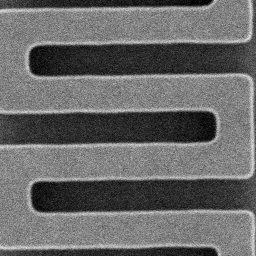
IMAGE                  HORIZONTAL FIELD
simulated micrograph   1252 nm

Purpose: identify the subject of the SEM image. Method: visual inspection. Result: groups of lines, slits or small figures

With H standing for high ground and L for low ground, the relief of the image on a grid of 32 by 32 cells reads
LLLLLLLLLLLLLLLLLLLLLLLLLLHHHHHL
HHHHHHHHHHHHHHHHHHHHHHHHHHHHHHHL
HHHHHHHHHHHHHHHHHHHHHHHHHHHHHHHL
HHHHHHHHHHHHHHHHHHHHHHHHHHHHHHHL
HHHHHHHHHHHHHHHHHHHHHHHHHHHHHHHL
HHHHHHHHHLLLLLLLLLLLLLLLLLLLLLLL
HHHHLLLLLLLLLLLLLLLLLLLLLLLLLLLL
HHHHLLLLLLLLLLLLLLLLLLLLLLLLLLLL
HHHHLLLLLLLLLLLLLLLLLLLLLLLLLLLL
HHHHHLLLLLHHLLLLHHHHHHHHHHHHHHHL
HHHHHHHHHHHHHHHHHHHHHHHHHHHHHHHH
HHHHHHHHHHHHHHHHHHHHHHHHHHHHHHHH
HHHHHHHHHHHHHHHHHHHHHHHHHHHHHHHH
HHHHHHHHHHHHHHHHHHHHHHHHHHHHHHHH
LLLLLLLLLLLLLLLLLLLLLLLLLLLHHHHH
LLLLLLLLLLLLLLLLLLLLLLLLLLLHHHHH
LLLLLLLLLLLLLLLLLLLLLLLLLLLHHHHH
LLLLLLLLLLLLLLLLLLLLLLLLLLLHHHHH
HHHHHHHHHHHHHHHHHHHHHHHHHHHHHHHH
HHHHHHHHHHHHHHHHHHHHHHHHHHHHHHHH
HHHHHHHHHHHHHHHHHHHHHHHHHHHHHHHH
HHHHHHHHHHHHHHHHHHHHHHHHHHHHHHHH
HHHHHHHHHHHHHLLLLLLLLLLLLLLLLLLL
HHHHLLLLLLLLLLLLLLLLLLLLLLLLLLLL
HHHHLLLLLLLLLLLLLLLLLLLLLLLLLLLL
HHHHLLLLLLLLLLLLLLLLLLLLLLLLLLLL
HHHHHLLLLLLLLLLLLLLHHHHHHHHHHHHL
HHHHHHHHHHHHHHHHHHHHHHHHHHHHHHHH
HHHHHHHHHHHHHHHHHHHHHHHHHHHHHHHH
HHHHHHHHHHHHHHHHHHHHHHHHHHHHHHHH
HHHHHHHHHHHHHHHHHHHHHHHHHHHHHHHH
LLLLLLLLLLLLLLLLLLLLLLLLLLLHHHHH